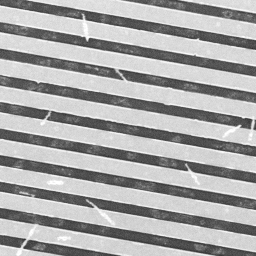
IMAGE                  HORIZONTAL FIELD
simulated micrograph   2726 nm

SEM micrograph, parallel lines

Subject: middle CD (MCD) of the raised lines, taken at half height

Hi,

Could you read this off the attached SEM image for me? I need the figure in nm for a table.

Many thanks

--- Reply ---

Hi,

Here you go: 167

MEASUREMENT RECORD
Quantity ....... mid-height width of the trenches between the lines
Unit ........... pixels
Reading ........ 11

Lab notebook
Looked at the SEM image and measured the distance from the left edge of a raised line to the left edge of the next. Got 279 nm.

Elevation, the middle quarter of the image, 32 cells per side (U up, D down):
DDDDDDDDDDUUUUUUUUUUUUUUUUUUUUUU
DDDDDDDDDDDDDDDUUUUUUUUUUUUUUUUU
UUUUUDDDDDDDDDDDDDDDDDUUUUUUUUUU
UUUUUUUUUUUDDDDDDDDDDDDDDDDDUUUU
UUUUUUUUUUUUUUUUUDDDDDDDDDDDDDDD
UUUUUUUUUUUUUUUUUUUUUUDDDDDDDDDD
DDDDDDUUUUUUUUUUUUUUUUUUUUUUDDDD
DDDDDDDDDDDDUUUUUUUUUUUUUUUUUUUU
UDDDDDDDDDDDDDDDDUUUUUUUUUUUUUUU
UUUUUUDDDDDDDDDDDDDDDDDUUUUUUUUU
UUUUUUUUUUUUDDDDDDDDDDDDDDDDDUUU
UUUUUUUUUUUUUUUUUUDDDDDDDDDDDDDD
DUUUUUUUUUUUUUUUUUUUUUUUDDDDDDDD
DDDDDDDUUUUUUUUUUUUUUUUUUUUUUDDD
DDDDDDDDDDDDDUUUUUUUUUUUUUUUUUUU
UUUDDDDDDDDDDDDDDDDUUUUUUUUUUUUU
UUUUUUUUUDDDDDDDDDDDDDDDUUUUUUUU
UUUUUUUUUUUUUUUDDDDDDDDDDDDDDDUU
UUUUUUUUUUUUUUUUUUUUDDDDDDDDDDDD
DDDDUUUUUUUUUUUUUUUUUUUUUUDDDDDD
DDDDDDDDDDUUUUUUUUUUUUUUUUUUUUUU
DDDDDDDDDDDDDDDDUUUUUUUUUUUUUUUU
UUUUUUDDDDDDDDDDDDDDDUUUUUUUUUUU
UUUUUUUUUUUDDDDDDDDDDDDDDDDUUUUU
UUUUUUUUUUUUUUUUUDDDDDDDDDDDDDDD
UUUUUUUUUUUUUUUUUUUUUUUDDDDDDDDD
DDDDDDUUUUUUUUUUUUUUUUUUUUUUDDDD
DDDDDDDDDDDDUUUUUUUUUUUUUUUUUUUU
UDDDDDDDDDDDDDDDDDUUUUUUUUUUUUUU
UUUUUUUDDDDDDDDDDDDDDDDDUUUUUUUU
UUUUUUUUUUUUUDDDDDDDDDDDDDDDDDUU
UUUUUUUUUUUUUUUUUUUDDDDDDDDDDDDD